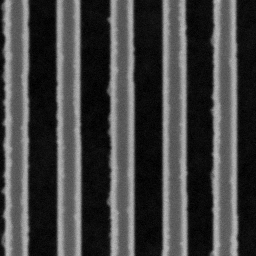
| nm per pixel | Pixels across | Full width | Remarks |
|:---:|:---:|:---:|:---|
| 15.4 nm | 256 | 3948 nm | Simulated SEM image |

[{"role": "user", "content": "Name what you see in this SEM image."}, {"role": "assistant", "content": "lines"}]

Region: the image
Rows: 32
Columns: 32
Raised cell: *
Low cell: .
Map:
.**....***....**.....**....**...
.**....***....**.....**....**...
.**....***....**.....**....**...
.**....***....**.....**....**...
.**....***....**.....**....**...
.**....***....**.....**....**...
.**....***....**.....**....**...
.**....***....**.....**....**...
.**....***....**.....**....**...
.**....***....**.....**....**...
.**....***....**.....**....**...
.**....***....**.....**....**...
.**....***....**.....**....**...
.**....***....***....**....**...
.**....***....**.....**....**...
.**....***....**.....**....**...
.**....***....***....**....**...
.**....***....***....**....**...
.**....***....***....**....**...
.**....***....**.....**....**...
.**....***....**.....**....**...
.**....***....**.....**....**...
.**....***....***....**....**...
.**....***....***....**....**...
.**....***....***....**....**...
.**....***....***....**....**...
.**....***....***....**....**...
.**....***....***....**....**...
.**....***....***....**....**...
.**....***....***....**....**...
.**....***....***....**....**...
.**....***....***....**....**...